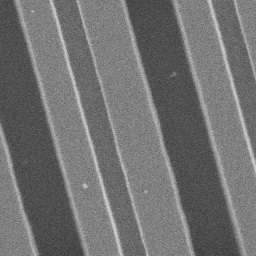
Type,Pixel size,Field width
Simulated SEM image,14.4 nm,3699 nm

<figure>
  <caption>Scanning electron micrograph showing lines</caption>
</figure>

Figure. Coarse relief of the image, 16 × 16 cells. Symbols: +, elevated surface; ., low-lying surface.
.+++++++...+++++
.+++++++...+++++
..++++++....++++
..+++++++...++++
..+++++++...++++
...++++++...++++
...++++++....+++
...+++++++...+++
...+++++++...+++
....++++++....++
+...+++++++...++
+...+++++++...++
+....++++++...++
++...++++++....+
++...+++++++...+
++...+++++++...+